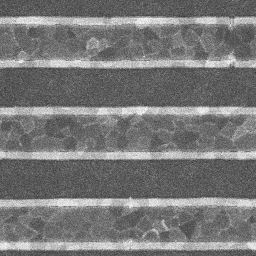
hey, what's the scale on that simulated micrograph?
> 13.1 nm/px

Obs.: one or a few lines or trenches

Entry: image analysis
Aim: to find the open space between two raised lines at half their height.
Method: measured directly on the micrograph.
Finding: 47.6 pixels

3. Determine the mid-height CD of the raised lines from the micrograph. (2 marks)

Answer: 42.8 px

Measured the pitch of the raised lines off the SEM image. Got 1190 nm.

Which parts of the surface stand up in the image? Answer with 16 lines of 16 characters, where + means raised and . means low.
................
++++++++++++++++
++++++++++++++++
++++++++++++++++
................
................
................
++++++++++++++++
++++++++++++++++
++++++++++++++++
................
................
................
++++++++++++++++
++++++++++++++++
................